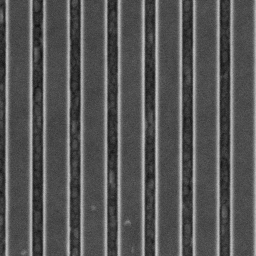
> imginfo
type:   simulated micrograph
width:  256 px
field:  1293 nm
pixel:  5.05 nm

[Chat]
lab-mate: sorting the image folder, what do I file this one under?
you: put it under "parallel lines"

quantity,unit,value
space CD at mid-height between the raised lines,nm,56.8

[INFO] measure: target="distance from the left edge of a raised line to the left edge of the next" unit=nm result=189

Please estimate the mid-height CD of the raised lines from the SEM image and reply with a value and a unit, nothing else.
0.131 micrometres